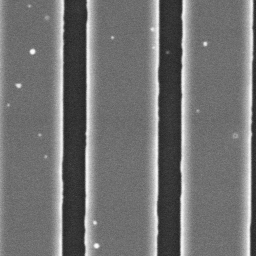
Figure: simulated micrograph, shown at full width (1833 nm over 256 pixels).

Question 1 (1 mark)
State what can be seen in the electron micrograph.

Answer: lines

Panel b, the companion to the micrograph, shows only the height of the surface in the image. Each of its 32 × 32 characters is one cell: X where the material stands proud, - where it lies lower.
XXXXXXXX---XXXXXXXXX---XXXXXXXXX
XXXXXXXX---XXXXXXXXX---XXXXXXXXX
XXXXXXXX---XXXXXXXXX---XXXXXXXXX
XXXXXXXX---XXXXXXXXX---XXXXXXXXX
XXXXXXXX---XXXXXXXXX---XXXXXXXXX
XXXXXXXX---XXXXXXXXX---XXXXXXXXX
XXXXXXXX---XXXXXXXXX---XXXXXXXXX
XXXXXXXX---XXXXXXXXX---XXXXXXXXX
XXXXXXXX---XXXXXXXXX---XXXXXXXX-
XXXXXXXX---XXXXXXXXX---XXXXXXXX-
XXXXXXXX---XXXXXXXXX---XXXXXXXX-
XXXXXXXX---XXXXXXXXX---XXXXXXXX-
XXXXXXXX---XXXXXXXXX---XXXXXXXX-
XXXXXXXX---XXXXXXXXX---XXXXXXXX-
XXXXXXXX---XXXXXXXXX---XXXXXXXX-
XXXXXXXX---XXXXXXXXX---XXXXXXXX-
XXXXXXXX---XXXXXXXXX---XXXXXXXX-
XXXXXXXX---XXXXXXXXX---XXXXXXXX-
XXXXXXXX---XXXXXXXXX---XXXXXXXX-
XXXXXXXX---XXXXXXXXX---XXXXXXXX-
XXXXXXXX---XXXXXXXXX---XXXXXXXX-
XXXXXXXX---XXXXXXXXX---XXXXXXXX-
XXXXXXXX---XXXXXXXXX---XXXXXXXX-
XXXXXXXX---XXXXXXXXX---XXXXXXXX-
XXXXXXXX---XXXXXXXXX---XXXXXXXX-
XXXXXXXX---XXXXXXXXX---XXXXXXXX-
XXXXXXXX---XXXXXXXXX---XXXXXXXX-
XXXXXXXX---XXXXXXXXX---XXXXXXXX-
XXXXXXXX---XXXXXXXXX---XXXXXXXX-
XXXXXXXX---XXXXXXXXX---XXXXXXXX-
XXXXXXXX---XXXXXXXXX---XXXXXXXX-
XXXXXXXX---XXXXXXXXX---XXXXXXXX-